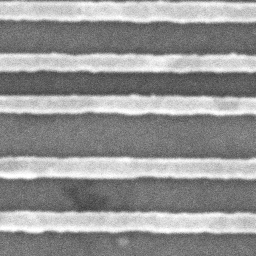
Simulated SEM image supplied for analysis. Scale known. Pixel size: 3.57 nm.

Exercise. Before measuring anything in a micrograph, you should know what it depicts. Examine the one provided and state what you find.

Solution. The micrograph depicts lines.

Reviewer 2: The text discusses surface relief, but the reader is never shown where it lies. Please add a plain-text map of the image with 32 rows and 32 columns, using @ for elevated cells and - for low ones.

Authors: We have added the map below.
@@@@@@@@@@@@@@@@@@@@@@@@@@@@@-@@
@@@@@@@@@@@@@@@@@@@@@@@@@@@@@@@@
-------@@@------@@@@@@@@@@@@@@@@
--------------------------------
--------------------------------
--------------------------------
--------------------------------
@@@@@@@@@@@@@@@@@@@@@@@@@@@@@@@@
@@@@@@@@@@@@@@@@@@@@@@@@@@@@@@@@
--------------------------------
--------------------------------
--------------------------------
@@@@@@@@@@@@@@@@@@@@@@@@@@@@@@@@
@@@@@@@@@@@@@@@@@@@@@@@@@@@@@@@@
--------------------------------
--------------------------------
--------------------------------
--------------------------------
--------------------------------
--------------------------------
@@@@@@@@@@@@@@@@@@@@@@@@@@@@@@@@
@@@@@@@@@@@@@@@@@@@@@@@@@@@@@@@@
--------------------------------
--------------------------------
--------------------------------
--------------------------------
--@@----------------------------
@@@@@@@@@@@@@@@@@@@@@@@@@@@@@@@@
@@@@@@@@@@@@@@@@@@@@@@@@@@@@@@@@
--------------------------------
--------------------------------
--------------------------------